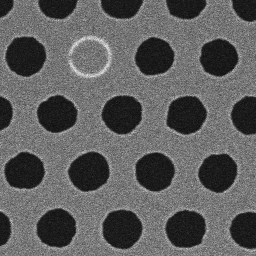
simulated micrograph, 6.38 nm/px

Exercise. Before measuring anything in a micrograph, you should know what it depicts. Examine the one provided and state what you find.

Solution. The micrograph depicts a regular array of holes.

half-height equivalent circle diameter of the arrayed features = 251 nm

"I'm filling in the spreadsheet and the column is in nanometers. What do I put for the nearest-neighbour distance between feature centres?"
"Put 410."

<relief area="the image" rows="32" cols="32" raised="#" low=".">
..###.....###.....###.....###...
.####....####....####....####...
##############################..
################################
################################
#....#############...#####...###
#.....###########.....###.....##
#.....###########.....###.....##
#....############....####....###
###.#######################.####
################################
################################
.#####...#####...#####...#####..
.####....####.....###.....###...
.####.....###.....###.....###...
.####....####....####....####...
######..######..######..######..
################################
################################
##..######...#####...#####...###
#....####....####.....###.....##
#.....##......###.....###.....##
#....####....####.....###....###
##..######..######...#####...###
################################
################################
######..######..######..########
.####....####....####.....###...
.###......###.....###.....###...
.####....####.....###....####...
.#####...#####...#####...#####..
################################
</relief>